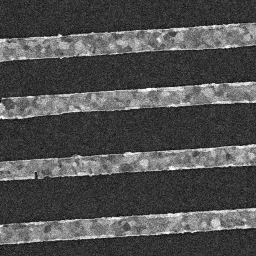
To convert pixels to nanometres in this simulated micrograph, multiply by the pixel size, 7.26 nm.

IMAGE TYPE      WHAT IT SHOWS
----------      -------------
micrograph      one or a few lines or trenches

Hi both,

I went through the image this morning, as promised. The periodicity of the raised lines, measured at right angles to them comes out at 444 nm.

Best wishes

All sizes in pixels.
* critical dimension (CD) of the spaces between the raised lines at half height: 43.4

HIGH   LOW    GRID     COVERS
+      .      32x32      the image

................................
................................
................................
.......................+++++++++
.......+++++++++++++++++++++++++
++++++++++++++++++++++++++++++++
++++++++++++++++++..............
++..............................
................................
................................
..........................++++++
............++++++++++++++++++++
++++++++++++++++++++++++++++++++
++++++++++++++++++..............
++++............................
................................
................................
................................
...........................+++++
.........+..++++++++++++++++++++
++++++++++++++++++++++++++++++++
++++++++++++++++................
+...............................
................................
................................
................................
.........................+++++++
.........+++++++++++++++++++++++
+++++++++++++++++++++++++++++++.
++++++++++++++++................
+...............................
................................